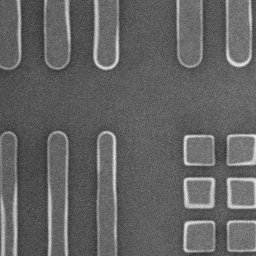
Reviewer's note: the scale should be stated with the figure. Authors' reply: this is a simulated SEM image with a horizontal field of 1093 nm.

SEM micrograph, groups of lines, slits or small figures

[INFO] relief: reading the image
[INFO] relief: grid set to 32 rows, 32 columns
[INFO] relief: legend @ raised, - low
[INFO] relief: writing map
@@----@@----@@@-------@@@---@@@-
@@----@@----@@@-------@@@---@@@-
@@----@@----@@@-------@@@---@@@-
@@----@@@---@@@-------@@@---@@@-
@@----@@@---@@@-------@@@---@@@-
@@----@@@---@@@-------@@@---@@@-
@@@---@@@---@@@-------@@@---@@@-
@@----@@@---@@@-------@@@----@@-
@@-----@------------------------
--------------------------------
--------------------------------
--------------------------------
--------------------------------
--------------------------------
--------------------------------
--------------------------------
--------------------------------
@@----@@----@@---------@@@@--@@@
@@----@@----@@---------@@@@--@@@
@@----@@----@@---------@@@@-@@@@
@@----@@----@@----------@@@--@--
@@----@@----@@------------------
@@----@@----@@---------@@@---@@-
@@----@@----@@---------@@@@--@@@
@@----@@----@@---------@@@@--@@@
@@----@@----@@---------@@@---@@@
@@----@@----@@------------------
@@----@@----@@------------------
@@----@@----@@---------@@@@--@@@
@@----@@----@@---------@@@@--@@@
@@----@@----@@---------@@@@--@@@
@@----@@----@@------------------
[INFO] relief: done